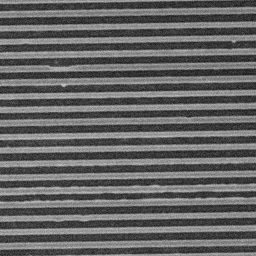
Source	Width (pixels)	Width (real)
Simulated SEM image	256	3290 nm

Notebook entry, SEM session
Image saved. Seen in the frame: parallel lines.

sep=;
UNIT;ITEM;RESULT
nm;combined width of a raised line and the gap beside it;175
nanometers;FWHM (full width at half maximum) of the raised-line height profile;70.7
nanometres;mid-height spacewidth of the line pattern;103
